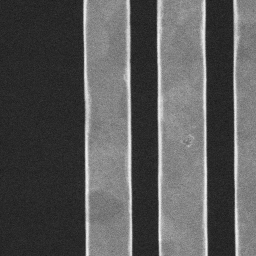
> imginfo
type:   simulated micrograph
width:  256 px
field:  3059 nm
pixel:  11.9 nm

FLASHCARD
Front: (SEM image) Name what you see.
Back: wiring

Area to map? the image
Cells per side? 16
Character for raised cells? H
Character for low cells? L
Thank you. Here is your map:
LLLLLHHHLLHHHLLH
LLLLLHHHLLHHHLLH
LLLLLHHHLLHHHLLH
LLLLLHHHLLHHHLLH
LLLLLHHHLLHHHLLH
LLLLLHHHLLHHHLLH
LLLLLHHHLLHHHLLH
LLLLLHHHLLHHHLLH
LLLLLHHHLLHHHLLH
LLLLLHHHLLHHHLLH
LLLLLHHHLLHHHLLH
LLLLLHHHLLHHHLLH
LLLLLHHHLLHHHLLH
LLLLLHHHLLHHHLLH
LLLLLHHHLLHHHLLH
LLLLLHHHLLHHHLLH